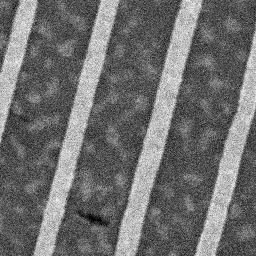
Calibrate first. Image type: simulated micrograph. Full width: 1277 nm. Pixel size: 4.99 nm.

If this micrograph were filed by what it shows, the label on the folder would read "one or a few lines or trenches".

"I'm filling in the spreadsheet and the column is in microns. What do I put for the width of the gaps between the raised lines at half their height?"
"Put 0.305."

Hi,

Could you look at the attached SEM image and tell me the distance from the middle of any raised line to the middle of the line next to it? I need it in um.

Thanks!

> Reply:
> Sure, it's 0.394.